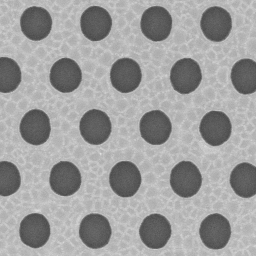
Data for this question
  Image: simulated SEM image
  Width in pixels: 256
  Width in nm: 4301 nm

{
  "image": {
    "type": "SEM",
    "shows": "a regular array of holes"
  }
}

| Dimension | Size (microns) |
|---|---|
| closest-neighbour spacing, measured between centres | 1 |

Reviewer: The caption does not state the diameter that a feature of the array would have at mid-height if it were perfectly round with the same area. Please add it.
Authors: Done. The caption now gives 574 nm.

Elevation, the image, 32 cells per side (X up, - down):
XXXXXXXXXXXXXXXXXXXXXXXXXXXXXXXX
XXX---XXXX---XXXXX---XXXX---XXXX
XXX---XXXX----XXXX---XXXX----XXX
XXX---XXXX----XXXX---XXXX----XXX
XXX---XXXXX--XXXXX---XXXXX--XXXX
XXXXXXXXXXXXXXXXXXXXXXXXXXXXXXXX
XXXXXXXXXXXXXXXXXXXXXXXXXXXXXXXX
--XXXXX--XXXXXX--XXXXX--XXXXXX--
---XXX----XXXX----XXX----XXXX---
---XXX----XXXX----XXX----XXXX---
---XXX----XXXX---XXXX----XXXX---
-XXXXXXX-XXXXXX-XXXXXX--XXXXXX--
XXXXXXXXXXXXXXXXXXXXXXXXXXXXXXXX
XXXXXXXXXXXXXXXXXXXXXXXXXXXXXXXX
XXX---XXXX----XXXX---XXXX---XXXX
XX----XXXX----XXX----XXXX----XXX
XX----XXXX----XXX----XXXX----XXX
XXX---XXXXX--XXXXX---XXXX---XXXX
XXXXXXXXXXXXXXXXXXXXXXXXXXXXXXXX
XXXXXXXXXXXXXXXXXXXXXXXXXXXXXXXX
--XXXXX--XXXXX---XXXXX--XXXXXX-X
--XXXX----XXXX---XXXX----XXXX---
---XXX----XXXX----XXX----XXXX---
--XXXX----XXXX---XXXX----XXXX---
-XXXXXXXXXXXXXX-XXXXXX--XXXXXX--
XXXXXXXXXXXXXXXXXXXXXXXXXXXXXXXX
XXXXXXXXXXXXXXXXXXXXXXXXXXXXXXXX
XXX---XXXX---XXXXX---XXXX---XXXX
XX----XXXX----XXX----XXXX----XXX
XX----XXXX----XXX----XXXX----XXX
XXX---XXXXX--XXXXX---XXXX---XXXX
XXXXXXXXXXXXXXXXXXXXXXXXXXXXXXXX